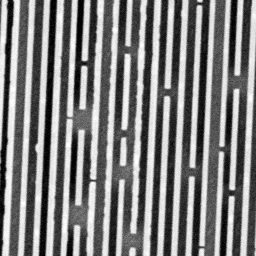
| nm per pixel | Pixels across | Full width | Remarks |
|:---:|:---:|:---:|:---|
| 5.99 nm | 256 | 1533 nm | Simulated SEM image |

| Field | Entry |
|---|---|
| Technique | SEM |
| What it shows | parallel lines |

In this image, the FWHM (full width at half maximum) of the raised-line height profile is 33.6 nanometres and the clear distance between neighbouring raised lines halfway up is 50.8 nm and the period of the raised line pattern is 83.6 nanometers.